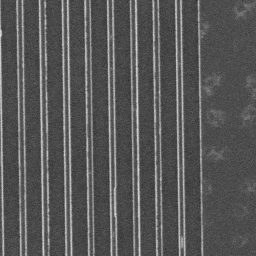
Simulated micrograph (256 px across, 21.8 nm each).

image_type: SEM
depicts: parallel lines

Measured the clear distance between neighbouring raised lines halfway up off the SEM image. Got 382 nanometers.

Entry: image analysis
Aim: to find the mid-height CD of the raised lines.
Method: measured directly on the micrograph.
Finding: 120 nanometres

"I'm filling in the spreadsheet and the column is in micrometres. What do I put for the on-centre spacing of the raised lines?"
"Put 0.495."